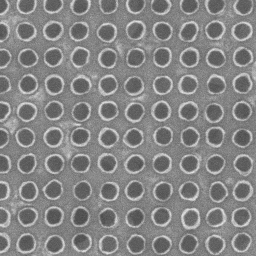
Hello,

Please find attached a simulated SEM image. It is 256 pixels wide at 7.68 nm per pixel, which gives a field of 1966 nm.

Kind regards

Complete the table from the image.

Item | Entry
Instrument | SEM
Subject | a regular array of raised bodies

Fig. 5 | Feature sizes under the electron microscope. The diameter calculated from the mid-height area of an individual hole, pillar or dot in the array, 140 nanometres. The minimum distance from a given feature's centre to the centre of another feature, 198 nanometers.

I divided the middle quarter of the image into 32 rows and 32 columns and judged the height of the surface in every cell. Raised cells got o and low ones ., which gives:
...oo.....oo....ooo.....oo....oo
................................
................................
...oo.....ooo...ooo....ooo....oo
..oooo...oooo...oooo...oooo..ooo
..oooo...oooo..ooooo...oooo..ooo
..oooo...oooo..ooooo...oooo..ooo
................oo..............
................................
........................o.......
...ooo...oooo...oooo...ooo...ooo
..oooo...oooo...oooo..ooooo..ooo
..oooo...oooo..ooooo..oooo...ooo
...ooo....oo....ooo....ooo....oo
................................
................................
...ooo....oo....ooo....oooo...oo
..oooo...oooo..ooooo...oooo..ooo
..oooo...ooooo.ooooo...oooo..ooo
..oooo...oooo..ooooo...oooo...oo
..........oo....oo............oo
................................
..........oo....................
..oooo...oooo...ooo....ooo....oo
..ooooo..oooo...oooo..oooo...ooo
..oooo...oooo...oooo..oooo...ooo
...ooo....oo....ooo....ooo....oo
................................
................................
....oo...........oo.............
...oooo..oooo...oooo...oooo...oo
...oooo..ooooo..oooo...oooo..ooo